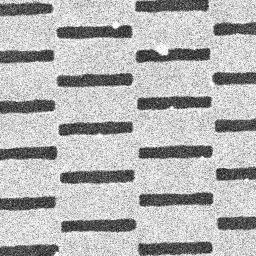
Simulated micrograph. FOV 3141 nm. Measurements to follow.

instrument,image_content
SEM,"a regular array of holes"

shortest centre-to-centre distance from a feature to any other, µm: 0.588